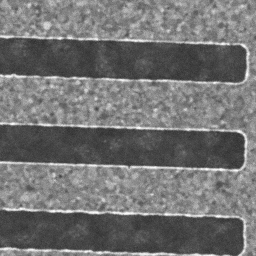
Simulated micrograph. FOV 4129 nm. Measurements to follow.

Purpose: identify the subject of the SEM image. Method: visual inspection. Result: one or a few lines or trenches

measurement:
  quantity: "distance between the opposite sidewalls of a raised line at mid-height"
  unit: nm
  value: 764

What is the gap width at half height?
0.633 um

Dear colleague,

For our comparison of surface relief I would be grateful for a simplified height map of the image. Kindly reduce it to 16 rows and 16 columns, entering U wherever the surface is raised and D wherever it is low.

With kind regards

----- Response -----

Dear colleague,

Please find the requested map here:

UUUUUUUUUUUUUUUU
UUUUUUUUUUUUUUUU
DDDDDDDUUUUUUUUU
DDDDDDDDDDDDDDDU
DDDDDDDDDDDDDDDU
UUUUUUUUUUUUUUUU
UUUUUUUUUUUUUUUU
UUUUUUUUUUUUUUUU
DDDDDDDDDDDDDDDU
DDDDDDDDDDDDDDDU
UUUUUUUUUUDDDDDU
UUUUUUUUUUUUUUUU
UUUUUUUUUUUUUUUU
DDDDDDDDDDDDDDUU
DDDDDDDDDDDDDDDU
DDDDDDDDDDDDDDDU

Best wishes